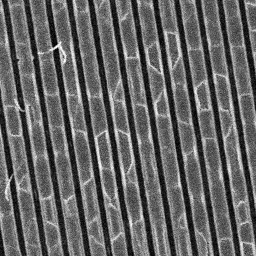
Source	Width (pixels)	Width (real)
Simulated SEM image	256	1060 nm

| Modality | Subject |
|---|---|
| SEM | parallel lines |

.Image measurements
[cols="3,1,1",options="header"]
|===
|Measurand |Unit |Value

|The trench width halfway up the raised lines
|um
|0.0256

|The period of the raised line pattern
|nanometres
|87.9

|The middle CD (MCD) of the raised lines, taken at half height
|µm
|0.0624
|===